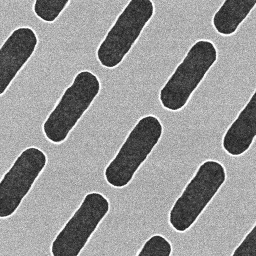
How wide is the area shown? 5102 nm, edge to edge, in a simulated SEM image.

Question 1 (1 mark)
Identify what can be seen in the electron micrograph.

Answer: holes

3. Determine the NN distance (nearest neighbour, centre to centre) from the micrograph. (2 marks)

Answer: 1.53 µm